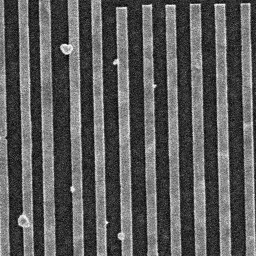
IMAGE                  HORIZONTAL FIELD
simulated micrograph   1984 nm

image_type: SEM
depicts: parallel lines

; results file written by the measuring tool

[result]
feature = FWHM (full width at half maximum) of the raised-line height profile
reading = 74.6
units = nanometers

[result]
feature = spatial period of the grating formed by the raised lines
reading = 191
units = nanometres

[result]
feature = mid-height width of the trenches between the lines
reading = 14.7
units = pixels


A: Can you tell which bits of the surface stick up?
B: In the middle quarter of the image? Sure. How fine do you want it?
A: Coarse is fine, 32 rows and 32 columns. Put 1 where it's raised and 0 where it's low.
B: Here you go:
00110001110001110000110000110000
00110001100000110000110000110000
00110001100000110000110000110000
00110001100000110000110000110000
00110001100000110000110000110000
00110001100000110000111000110000
00110001100000110000110000110000
00110000100000110000110000110000
00110000110000110000110000110000
00110000110000110000110000110000
00110000110000110000110000110000
00110000110000110000110000110000
00110000110000110000110000110000
00110000110000110000110000110000
00110000110000110000110000110000
00110000110000110000111000110000
00110000110000110000111000110000
00110000110000110000111000110000
00110000110000110000111000110000
00110000110000110000111000110000
00110000110000110000111000111000
00110000110000110000111000111000
00110000110000110000011000111000
00110000110000110000011000111000
00110000110000110000011000111000
00110000110000110000011000111000
00110000110000110000011000111000
00110000110000110000011000011000
00110000110000110000011000011000
00110000110000111000011000011000
00110000110000111000011000011000
00110000110000111000011000011000